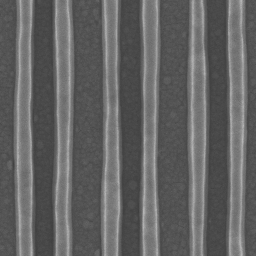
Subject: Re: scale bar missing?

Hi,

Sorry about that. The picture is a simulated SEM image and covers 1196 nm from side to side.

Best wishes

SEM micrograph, parallel lines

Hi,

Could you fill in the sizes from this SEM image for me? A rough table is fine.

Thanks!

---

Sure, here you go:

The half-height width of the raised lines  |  70.6 nanometers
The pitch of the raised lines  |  198 nm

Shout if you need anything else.